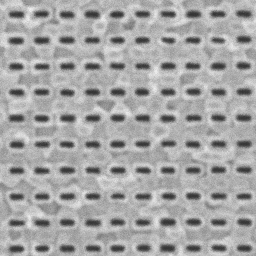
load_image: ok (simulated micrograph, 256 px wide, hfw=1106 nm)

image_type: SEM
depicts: a regular array of holes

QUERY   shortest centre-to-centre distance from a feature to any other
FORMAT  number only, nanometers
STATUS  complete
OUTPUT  108